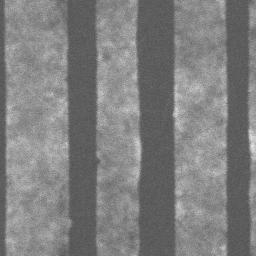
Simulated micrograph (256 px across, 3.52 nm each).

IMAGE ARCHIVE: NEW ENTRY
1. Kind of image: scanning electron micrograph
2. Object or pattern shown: one or a few lines or trenches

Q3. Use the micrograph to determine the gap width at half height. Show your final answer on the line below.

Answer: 106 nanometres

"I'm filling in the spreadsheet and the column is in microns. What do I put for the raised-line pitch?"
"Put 0.288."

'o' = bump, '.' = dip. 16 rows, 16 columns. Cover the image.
oooo..ooo..ooo..
oooo..ooo..ooo..
oooo..ooo..ooo..
oooo..ooo..ooo..
oooo..ooo..ooo..
oooo..ooo..ooo..
oooo..ooo..ooo..
oooo..ooo..ooo..
oooo..ooo..ooo..
oooo..ooo..ooo..
oooo..ooo..ooo..
oooo..ooo..ooo..
oooo..ooo..ooo..
oooo..ooo..ooo..
oooo..ooo..ooo..
oooo..ooo..ooo..